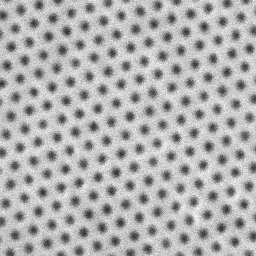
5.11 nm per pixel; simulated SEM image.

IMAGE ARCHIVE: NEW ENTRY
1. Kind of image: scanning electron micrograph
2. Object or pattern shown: a regular array of holes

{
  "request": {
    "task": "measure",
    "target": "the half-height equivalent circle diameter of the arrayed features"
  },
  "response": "57.9 nm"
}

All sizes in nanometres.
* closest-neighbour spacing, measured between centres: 95.4